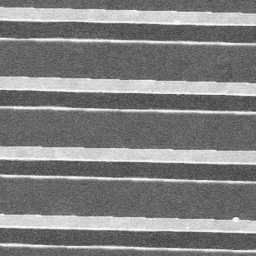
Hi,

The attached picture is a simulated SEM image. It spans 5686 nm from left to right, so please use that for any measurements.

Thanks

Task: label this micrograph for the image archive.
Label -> lines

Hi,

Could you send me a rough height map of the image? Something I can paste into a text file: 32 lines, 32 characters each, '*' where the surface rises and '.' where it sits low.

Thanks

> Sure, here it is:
********************************
********************************
.......*************************
................................
................................
****************************....
********************************
********************************
********************************
********************************
********************************
..................**************
................................
***.............................
********************************
********************************
********************************
********************************
********************************
********************************
................................
................................
******************..............
********************************
********************************
********************************
********************************
********************************
............********************
................................
................................
********************************